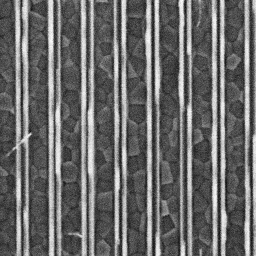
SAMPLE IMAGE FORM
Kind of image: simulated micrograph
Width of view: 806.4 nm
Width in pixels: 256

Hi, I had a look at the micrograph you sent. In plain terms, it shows parallel lines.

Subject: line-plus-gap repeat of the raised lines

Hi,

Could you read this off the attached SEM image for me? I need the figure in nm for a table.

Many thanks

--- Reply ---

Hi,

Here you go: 103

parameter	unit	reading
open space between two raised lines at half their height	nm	69.4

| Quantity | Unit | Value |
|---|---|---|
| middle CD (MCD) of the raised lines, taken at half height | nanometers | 34.9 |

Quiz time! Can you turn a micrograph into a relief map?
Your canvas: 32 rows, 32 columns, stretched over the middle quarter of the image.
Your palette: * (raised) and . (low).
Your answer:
.....**......**......***.....***
.....**......**......***.....***
.....**......**......***.....***
.....**......**......***.....***
.....**......**......***.....***
.....**......**......***.....***
.....**......**......***.....***
.....**......**......***.....***
.....**......**......***.....***
.....**......**......**......***
.....**......**......**......***
.....**......**......**......***
.....**......**......**......***
.....**......**......**......***
.....**......**......**......***
.....**......**......**......***
.....**......**......**......***
.....**......**......**......***
.....**......**......**......***
.....**......**......***.....***
.....**......**......***.....***
.....**......**......***.....***
.....**......**......***.....***
.....**......**......***.....***
.....**......**......***.....***
.....**......**......***.....***
.....**......**......***.....***
.....**......**......***.....***
.....**......**......***.....***
.....**......**......***.....***
.....**......**......***.....***
.....**......**......***.....***